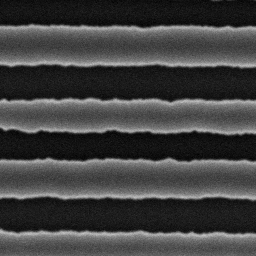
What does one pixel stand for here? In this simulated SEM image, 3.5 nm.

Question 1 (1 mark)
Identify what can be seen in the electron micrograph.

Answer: lines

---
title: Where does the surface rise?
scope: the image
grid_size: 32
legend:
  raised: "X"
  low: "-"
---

--------------------------------
--------------------------------
--------------------------------
XXXXXXXXXXXXXXXXX--XXXXXXXX-X-XX
XXXXXXXXXXXXXXXXXXXXXXXXXXXXXXXX
XXXXXXXXXXXXXXXXXXXXXXXXXXXXXXXX
XXXXXXXXXXXXXXXXXXXXXXXXXXXXXXXX
XXXXXXXXXXXXXXXXXXXXXXXXXXXXXXXX
--------------------------------
--------------------------------
--------------------------------
--------------------------------
--------X--X--------------------
XXXXXXXXXXXXXXXXXXXXXXXXXXXXXXXX
XXXXXXXXXXXXXXXXXXXXXXXXXXXXXXXX
XXXXXXXXXXXXXXXXXXXXXXXXXXXXXXXX
---X-----XX-X---X--XXXXX--XXXXXX
--------------------------------
--------------------------------
--------------------------------
XXXXXXXXXXXXXXXXXXXXXXXXXXXXXXXX
XXXXXXXXXXXXXXXXXXXXXXXXXXXXXXXX
XXXXXXXXXXXXXXXXXXXXXXXXXXXXXXXX
XXXXXXXXXXXXXXXXXXXXXXXXXXXXXXXX
XXXXXXXXXXXXXXXXXXXXXXXXXXXXXXXX
--------------------------------
--------------------------------
--------------------------------
--------------------------------
XXXXXXXXXXXXXXXXXXXXXXXXXXXXXXXX
XXXXXXXXXXXXXXXXXXXXXXXXXXXXXXXX
XXXXXXXXXXXXXXXXXXXXXXXXXXXXXXXX